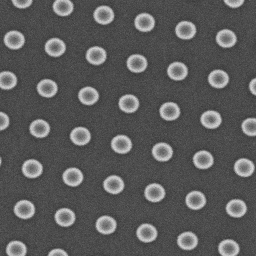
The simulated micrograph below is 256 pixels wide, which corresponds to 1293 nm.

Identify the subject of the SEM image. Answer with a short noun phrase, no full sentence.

a regular array of raised bodies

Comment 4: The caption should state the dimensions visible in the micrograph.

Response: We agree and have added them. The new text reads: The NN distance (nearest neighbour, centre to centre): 0.207 microns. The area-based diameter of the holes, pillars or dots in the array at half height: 91.2 nanometres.